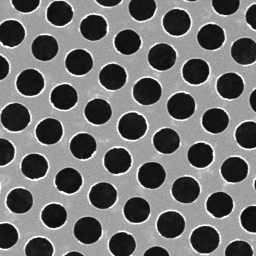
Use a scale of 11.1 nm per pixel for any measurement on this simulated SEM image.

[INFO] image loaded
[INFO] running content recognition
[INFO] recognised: a regular array of holes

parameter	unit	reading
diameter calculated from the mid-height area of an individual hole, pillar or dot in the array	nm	296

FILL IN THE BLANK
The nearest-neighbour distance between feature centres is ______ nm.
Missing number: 409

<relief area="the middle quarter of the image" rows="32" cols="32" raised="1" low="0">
00000001110000111111110000011100
10000001100000011111111000111100
11000111100000001111111111111100
11111111100000001111001111111100
11111111100000011100000011111110
00111111110000011000000011111111
00011111111111111000000011111111
00011111111111111000000011110001
00011111111111111100000011100000
00011100000111111100000111000000
00111000000111111111111111000000
01111000000011111111111111000000
11111000000011100001111111000000
11111000000011000000111111110001
11111110000111000000011111111111
11111111111111000000011111111111
11111111111111000000011100011111
11110011111111000000111000001111
11000001111111100001110000000111
11000000111111111111110000000111
10000000111111111111111000000111
11000000111000011111111000001110
11000001110000001111111111111110
11100011110000000111111111111110
11111111110000000111111111111110
11111111110000000110000011111111
00011111111000001110000001111111
00001111111111111100000001111111
00001111111111111100000001111000
00000111111111111110000001110000
00001110000011111111000011100000
00001110000001111111111111100000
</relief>